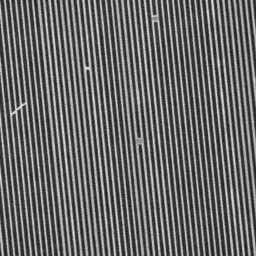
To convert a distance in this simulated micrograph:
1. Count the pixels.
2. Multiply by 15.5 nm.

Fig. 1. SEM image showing parallel lines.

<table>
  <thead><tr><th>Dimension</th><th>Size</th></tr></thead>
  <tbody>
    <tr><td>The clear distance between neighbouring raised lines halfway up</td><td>61.8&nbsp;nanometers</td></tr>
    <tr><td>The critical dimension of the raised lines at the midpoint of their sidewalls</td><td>0.0251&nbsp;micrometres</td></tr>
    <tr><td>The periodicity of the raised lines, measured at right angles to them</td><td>86.6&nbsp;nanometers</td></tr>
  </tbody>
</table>